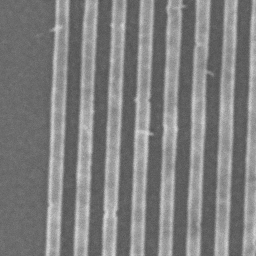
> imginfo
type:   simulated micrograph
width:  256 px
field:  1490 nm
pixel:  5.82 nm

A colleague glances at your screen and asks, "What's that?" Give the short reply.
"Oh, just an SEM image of parallel lines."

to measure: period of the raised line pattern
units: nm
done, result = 163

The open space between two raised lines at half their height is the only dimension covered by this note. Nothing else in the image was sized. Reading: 0.0973 microns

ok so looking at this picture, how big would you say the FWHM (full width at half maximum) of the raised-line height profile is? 66.1 nm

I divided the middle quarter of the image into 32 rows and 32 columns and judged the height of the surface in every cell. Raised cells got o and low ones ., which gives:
o....oo.....oo.....oo.....oo....
.....oo.....oo.....oo.....oo....
.....oo.....oo.....oo.....oo....
.....oo.....oo.....oo.....oo....
.....oo.....oo.....oo.....oo....
.....oo.....oo.....oo.....oo....
.....oo....ooo.....oo.....oo....
.....oo....ooo.....oo....ooo....
.....oo....ooo....ooo....ooo....
.....oo....ooo....ooo....ooo....
.....oo....ooo.....oo....ooo....
....ooo....ooo.....oo....ooo....
....ooo....ooo....ooo....ooo....
....ooo....ooo....ooo....ooo....
....ooo....ooo....ooo....ooo....
....ooo....ooo....ooo....ooo....
....ooo....ooo....ooo.....oo....
....ooo....ooo....ooo.....oo....
....ooo....ooo....ooo....ooo....
....ooo....ooo....ooo....ooo....
....ooo....ooo....ooo....ooo....
....oo.....ooo....ooo....ooo....
....oo.....oo.....oo.....ooo....
....oo.....oo.....oo.....oo.....
....oo.....oo.....oo.....oo.....
....oo.....oo.....oo.....oo.....
....oo.....oo.....oo.....oo.....
....oo.....oo.....oo.....oo.....
....oo.....oo.....oo.....oo.....
....oo.....oo.....oo.....oo.....
...ooo.....oo.....oo.....oo.....
...ooo....ooo.....oo.....oo.....